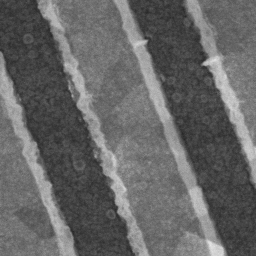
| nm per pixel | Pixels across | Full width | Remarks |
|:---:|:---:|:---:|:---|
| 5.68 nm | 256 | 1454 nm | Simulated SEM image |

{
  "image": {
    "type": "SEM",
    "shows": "one or a few lines or trenches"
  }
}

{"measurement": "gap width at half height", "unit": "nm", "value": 384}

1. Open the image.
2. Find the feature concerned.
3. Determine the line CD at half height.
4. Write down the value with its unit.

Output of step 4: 69.5 px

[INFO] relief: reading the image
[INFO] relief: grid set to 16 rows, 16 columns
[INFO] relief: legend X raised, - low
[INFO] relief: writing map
---XXXXX----XXXX
---XXXXX-----XXX
----XXXXX----XXX
----XXXXX----XXX
-----XXXX-----XX
-----XXXXX----XX
X----XXXXX----XX
X-----XXXX-----X
XX----XXXXX----X
XX-----XXXX-----
XX-----XXXXX----
XXX----XXXXX----
XXX-----XXXX----
XXX-----XXXXX---
XXXX----XXXXX---
XXXX-----XXXX---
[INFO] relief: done